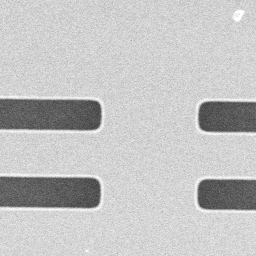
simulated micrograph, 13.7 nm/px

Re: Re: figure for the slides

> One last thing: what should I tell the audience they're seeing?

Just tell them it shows groups of lines, slits or small figures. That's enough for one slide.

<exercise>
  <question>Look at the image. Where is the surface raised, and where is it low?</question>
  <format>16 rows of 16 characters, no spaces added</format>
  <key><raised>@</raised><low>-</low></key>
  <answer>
@@@@@@@@@@@@@@@@
@@@@@@@@@@@@@@@@
@@@@@@@@@@@@@@@@
@@@@@@@@@@@@@@@@
@@@@@@@@@@@@@@@@
@@@@@@@@@@@@@@@@
------@@@@@@@---
------@@@@@@----
@@@@@@@@@@@@@@@@
@@@@@@@@@@@@@@@@
@@@@@@@@@@@@@@@@
------@@@@@@----
------@@@@@@----
@@@@@@@@@@@@@@@@
@@@@@@@@@@@@@@@@
@@@@@@@@@@@@@@@@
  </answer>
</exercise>